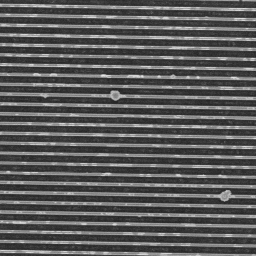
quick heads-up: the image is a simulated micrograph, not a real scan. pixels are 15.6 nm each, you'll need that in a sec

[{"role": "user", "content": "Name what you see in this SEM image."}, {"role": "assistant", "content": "parallel lines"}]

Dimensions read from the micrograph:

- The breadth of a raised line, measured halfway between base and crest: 0.0429 microns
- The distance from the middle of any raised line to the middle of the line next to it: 153 nanometers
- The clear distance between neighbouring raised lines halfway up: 113 nm